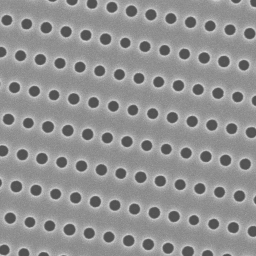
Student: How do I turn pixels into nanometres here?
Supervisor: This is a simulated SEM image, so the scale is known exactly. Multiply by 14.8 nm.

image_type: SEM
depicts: a regular array of holes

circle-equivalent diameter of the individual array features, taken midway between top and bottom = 172 nm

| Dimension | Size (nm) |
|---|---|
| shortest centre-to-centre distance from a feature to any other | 295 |